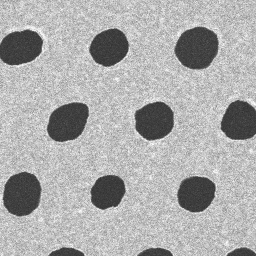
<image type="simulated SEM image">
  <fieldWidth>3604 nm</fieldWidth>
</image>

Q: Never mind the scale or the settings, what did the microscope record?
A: holes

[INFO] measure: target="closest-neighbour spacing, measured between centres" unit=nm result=1190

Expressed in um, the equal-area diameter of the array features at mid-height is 0.561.